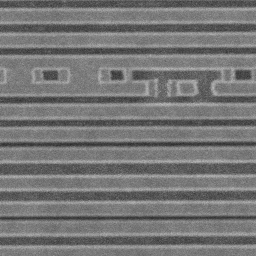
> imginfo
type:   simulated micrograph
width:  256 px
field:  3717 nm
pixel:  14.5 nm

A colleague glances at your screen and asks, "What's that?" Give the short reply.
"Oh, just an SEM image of parallel lines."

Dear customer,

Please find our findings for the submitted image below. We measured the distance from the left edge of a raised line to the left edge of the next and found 0.342 micrometres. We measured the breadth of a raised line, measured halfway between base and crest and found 0.203 micrometres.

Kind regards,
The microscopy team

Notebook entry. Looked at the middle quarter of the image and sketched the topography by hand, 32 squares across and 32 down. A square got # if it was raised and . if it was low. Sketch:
################################
###########....##...............
###########....##...............
###########....##...............
############...###...........###
#####################.......####
#####################.......####
#####################........###
................................
................................
################################
################################
################################
###################....#########
................................
................................
################################
################################
################################
................................
................................
################################
################################
################################
................................
................................
................................
................................
################################
################################
################################
................................